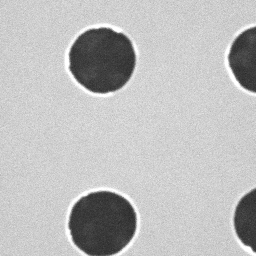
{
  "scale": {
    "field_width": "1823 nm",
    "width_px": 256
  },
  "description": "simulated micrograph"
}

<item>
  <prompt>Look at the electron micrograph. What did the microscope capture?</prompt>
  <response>holes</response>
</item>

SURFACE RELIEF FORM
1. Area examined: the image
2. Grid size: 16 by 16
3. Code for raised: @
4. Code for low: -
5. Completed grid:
@@@@@@@@@@@@@@@@
@@@@@@@@@@@@@@@@
@@@@@---@@@@@@@-
@@@@----@@@@@@--
@@@@----@@@@@@--
@@@@@---@@@@@@@-
@@@@@@@@@@@@@@@@
@@@@@@@@@@@@@@@@
@@@@@@@@@@@@@@@@
@@@@@@@@@@@@@@@@
@@@@@@@@@@@@@@@@
@@@@@@@@@@@@@@@@
@@@@@---@@@@@@@-
@@@@-----@@@@@@-
@@@@----@@@@@@@-
@@@@@---@@@@@@@-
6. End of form